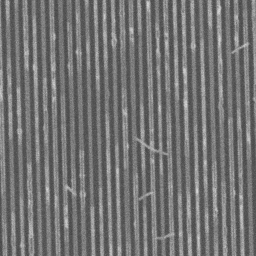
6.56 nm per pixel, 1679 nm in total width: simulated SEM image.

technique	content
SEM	parallel lines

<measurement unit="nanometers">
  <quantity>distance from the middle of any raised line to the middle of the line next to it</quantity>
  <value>57.7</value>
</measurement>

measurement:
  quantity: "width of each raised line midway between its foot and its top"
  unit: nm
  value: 24.6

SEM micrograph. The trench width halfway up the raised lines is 37.7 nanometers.